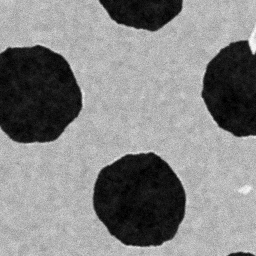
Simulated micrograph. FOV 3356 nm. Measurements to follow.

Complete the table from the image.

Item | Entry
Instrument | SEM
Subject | holes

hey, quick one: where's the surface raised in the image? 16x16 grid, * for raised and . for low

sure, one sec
******.....*****
********..******
****************
....*********...
.....********...
.....********...
.....********...
.....********...
....***********.
****************
*******....*****
******.....*****
******......****
******......****
*******....*****
****************